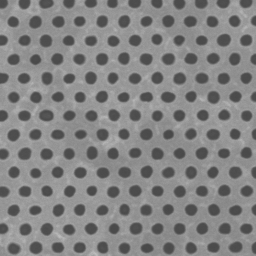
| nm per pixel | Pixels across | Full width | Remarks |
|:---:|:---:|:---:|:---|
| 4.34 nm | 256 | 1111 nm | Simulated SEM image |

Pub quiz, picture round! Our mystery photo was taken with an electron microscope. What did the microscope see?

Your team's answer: a regular array of holes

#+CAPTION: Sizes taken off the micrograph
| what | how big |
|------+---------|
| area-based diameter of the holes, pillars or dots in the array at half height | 0.0521 microns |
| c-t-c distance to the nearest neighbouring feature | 92.1 nanometres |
